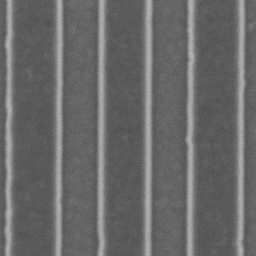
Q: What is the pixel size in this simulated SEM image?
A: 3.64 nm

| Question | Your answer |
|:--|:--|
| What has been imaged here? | one or a few lines or trenches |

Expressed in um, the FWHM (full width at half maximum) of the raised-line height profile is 0.191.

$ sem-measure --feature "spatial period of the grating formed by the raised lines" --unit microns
0.331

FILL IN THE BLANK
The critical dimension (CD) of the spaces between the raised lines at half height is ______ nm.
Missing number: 144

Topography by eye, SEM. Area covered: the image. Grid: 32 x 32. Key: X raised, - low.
-XXXXXXX-----XXXXXX-----XXXXXX--
-XXXXXXX-----XXXXXX-----XXXXXX--
-XXXXXXX-----XXXXXX-----XXXXXX--
-XXXXXXX-----XXXXXX-----XXXXXX--
-XXXXXXX-----XXXXXX-----XXXXXX--
-XXXXXXX-----XXXXXX-----XXXXXX--
-XXXXXXX-----XXXXXX-----XXXXXX--
-XXXXXXX-----XXXXXX-----XXXXXX--
-XXXXXXX-----XXXXXX-----XXXXXX--
-XXXXXXX-----XXXXXX-----XXXXXX--
-XXXXXXX-----XXXXXX-----XXXXXX--
-XXXXXXX-----XXXXXX-----XXXXXX--
-XXXXXXX-----XXXXXX-----XXXXXX--
-XXXXXXX-----XXXXXX-----XXXXXX--
-XXXXXXX-----XXXXXX-----XXXXXX--
-XXXXXXX-----XXXXXX-----XXXXXX--
-XXXXXX------XXXXXX-----XXXXXX--
-XXXXXX------XXXXXX-----XXXXXX--
-XXXXXX------XXXXXX-----XXXXXX--
-XXXXXX------XXXXXX-----XXXXXX--
-XXXXXX------XXXXXX-----XXXXXX--
-XXXXXX------XXXXXX-----XXXXXX--
-XXXXXX------XXXXXX-----XXXXXX--
-XXXXXX------XXXXXX-----XXXXXX--
-XXXXXX------XXXXXX-----XXXXXX--
-XXXXXX------XXXXXX-----XXXXXX--
-XXXXXX------XXXXXX-----XXXXXX--
-XXXXXX------XXXXXX-----XXXXXX--
-XXXXXX-----XXXXXXX-----XXXXXX--
-XXXXXX-----XXXXXXX-----XXXXXX--
-XXXXXX------XXXXXX-----XXXXXX--
-XXXXXX-----XXXXXXX-----XXXXXX--